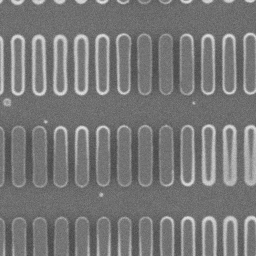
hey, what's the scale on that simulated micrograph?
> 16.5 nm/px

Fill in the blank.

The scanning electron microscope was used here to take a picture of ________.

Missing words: groups of lines, slits or small figures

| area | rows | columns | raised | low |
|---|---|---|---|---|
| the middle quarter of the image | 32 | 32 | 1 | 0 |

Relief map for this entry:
00011100111000110001110011100111
00011100111000110001110011100111
00011100111000110001110011100111
00011100011000110001110011100111
00011100011000110001110011100111
00011100011000110001110011100111
00011100011000110001110011100111
00000000000000000000000000000000
00000000000000000000000000000000
00000000000000000000000000000000
00000000000000000000000000000000
00000000000000000000000000000000
00000000000000000000000000000000
00000000000000000000000000000000
00000000000000000000000000000000
00000000000000000000000000000000
00011100011000110001110011100011
00011100011001111001110011100111
00011100011001111001110011100111
10011100011001111001110011100111
10011100111001111001110011100111
10011100111001111001110011100111
10011100111001111001110011100111
10011100111001111001110011100111
10011100111001111001110011100111
10011100111001111001110011100111
10011100111001111001110011100111
10011100111001111001110011100111
10011100111001111001110011100011
10011100011000111001110011100011
00001000000000000000000000000000
00000000000000000000000000000000